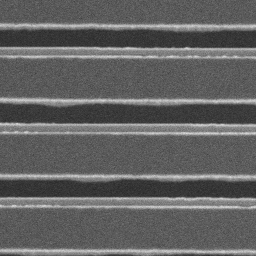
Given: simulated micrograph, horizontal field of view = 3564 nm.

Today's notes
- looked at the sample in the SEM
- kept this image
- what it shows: lines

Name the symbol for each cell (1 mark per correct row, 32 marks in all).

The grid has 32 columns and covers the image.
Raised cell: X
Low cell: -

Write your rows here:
XXXXXXXXXXXXXXXXXXXXXXXXXXXXXXXX
XXXXXXXXXXXXXXXXXXXXXXXXXXXXXXXX
XXXXXXXXXXXXXXXXXXXXXXXXXXXXXXXX
--------------------------------
--------------------------------
--------------------------------
XXXXXXXXXXXXXXXXXXXXXXXXXXXXXXXX
XXXXXXXXXXXXXXXXXXXXXXXXXXXXXXXX
XXXXXXXXXXXXXXXXXXXXXXXXXXXXXXXX
XXXXXXXXXXXXXXXXXXXXXXXXXXXXXXXX
XXXXXXXXXXXXXXXXXXXXXXXXXXXXXXXX
XXXXXXXXXXXXXXXXXXXXXXXXXXXXXXXX
XXXXXXXXXXXXXXXXXXXXXXXXXXXXXXXX
--------------------------------
--------------------------------
XXX-----------------------------
XXXXXXXXXXXXXXXXXXXXXXXXXXXXXXXX
XXXXXXXXXXXXXXXXXXXXXXXXXXXXXXXX
XXXXXXXXXXXXXXXXXXXXXXXXXXXXXXXX
XXXXXXXXXXXXXXXXXXXXXXXXXXXXXXXX
XXXXXXXXXXXXXXXXXXXXXXXXXXXXXXXX
XXXXXXXXXXXXXXXXXXXXXXXXXXXXXXXX
--------------------------------
--------------------------------
--------------------------------
XXXXXXXXXXXXXXXXXXXXXXXXXXXXXXXX
XXXXXXXXXXXXXXXXXXXXXXXXXXXXXXXX
XXXXXXXXXXXXXXXXXXXXXXXXXXXXXXXX
XXXXXXXXXXXXXXXXXXXXXXXXXXXXXXXX
XXXXXXXXXXXXXXXXXXXXXXXXXXXXXXXX
XXXXXXXXXXXXXXXXXXXXXXXXXXXXXXXX
----------XXX----XXXXXXXXXXXXXXX